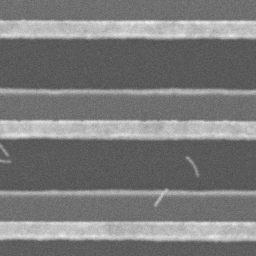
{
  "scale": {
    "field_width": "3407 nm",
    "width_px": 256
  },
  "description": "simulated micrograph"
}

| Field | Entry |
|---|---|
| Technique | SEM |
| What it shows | lines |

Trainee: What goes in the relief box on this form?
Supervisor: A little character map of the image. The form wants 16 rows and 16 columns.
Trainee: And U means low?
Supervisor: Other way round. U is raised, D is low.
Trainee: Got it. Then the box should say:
UUUUUUUUUUUUUUUU
UUUUUUUUUUUUUUUU
DDDDDDDDDDDDDDDD
DDDDDDDDDDDDDDDD
DDDDDDDDDDDDDDDD
DDDDDDDDDDDDDDDD
UUUUUUUUUUUUUUUU
UUUUUUUUUUUUUUUU
UUUUUUUUUUUUUUUU
DDDDDDDDDDDDDDDD
DDDDDDDDDDDDDDDD
DDDDDDDDDDDDDDDD
UUUUUUUUUUUUUUUU
UUUUUUUUUUUUUUUU
UUUUUUUUUUUUUUUU
DDDDDDDDDDDDDDDD